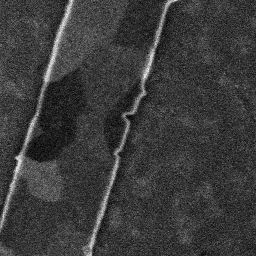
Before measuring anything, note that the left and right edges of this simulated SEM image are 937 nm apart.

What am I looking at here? one or a few lines or trenches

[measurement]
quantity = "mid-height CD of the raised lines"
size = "93.4 px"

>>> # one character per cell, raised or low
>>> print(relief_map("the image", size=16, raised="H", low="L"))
LLLLHHHHHHLLLLLL
LLLLHHHHHHLLLLLL
LLLLHHHHHHLLLLLL
LLLHHHHHHHLLLLLL
LLLHHHHHHLLLLLLL
LLLHHHHHHLLLLLLL
LLHHHHHHHLLLLLLL
LLHHHHHHLLLLLLLL
LLHHHHHHLLLLLLLL
LHHHHHHLLLLLLLLL
LHHHHHHLLLLLLLLL
LHHHHHHLLLLLLLLL
LHHHHHHLLLLLLLLL
HHHHHHLLLLLLLLLL
HHHHHHLLLLLLLLLL
HHHHHHLLLLLLLLLL